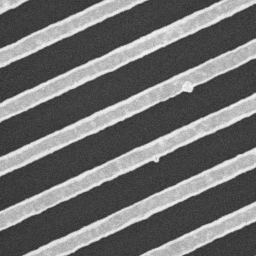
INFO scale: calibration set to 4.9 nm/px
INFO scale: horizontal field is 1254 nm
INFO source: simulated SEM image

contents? lines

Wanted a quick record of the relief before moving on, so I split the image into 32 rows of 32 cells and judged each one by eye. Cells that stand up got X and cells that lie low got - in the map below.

XXX---------XXXXX----------XXXXX
X---------XXXXX----------XXXXX--
--------XXXXX---------XXXXX-----
------XXXXX---------XXXXX-------
---XXXXXX---------XXXXX---------
--XXXX----------XXXXX----------X
XXXX----------XXXXX----------XXX
XX----------XXXXX---------XXXXX-
----------XXXXX---------XXXXX---
-------XXXXXX---------XXXXX-----
-----XXXXX----------XXXXX-------
---XXXXX----------XXXXX---------
-XXXXX----------XXXXX---------XX
XXXX---------XXXXX----------XXXX
XX---------XXXXX----------XXXXX-
---------XXXXX----------XXXXX---
-------XXXXX----------XXXXX-----
-----XXXXX----------XXXX--------
---XXXX----------XXXXX----------
XXXXX----------XXXXX----------XX
XXX----------XXXXX----------XXXX
X----------XXXXX---------XXXXX--
---------XXXXX---------XXXXXX---
------XXXXXX---------XXXXX------
----XXXXX----------XXXXX--------
--XXXXX----------XXXXX----------
XXXXX---------XXXXXX---------XXX
XXX----------XXXX----------XXXXX
X---------XXXXX----------XXXXX--
--------XXXXX----------XXXXX----
------XXXXX----------XXXXX------
----XXXXX----------XXXXX--------